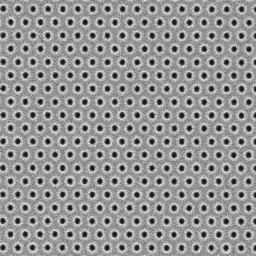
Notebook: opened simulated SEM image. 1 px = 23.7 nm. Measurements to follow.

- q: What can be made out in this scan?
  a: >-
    a regular array of holes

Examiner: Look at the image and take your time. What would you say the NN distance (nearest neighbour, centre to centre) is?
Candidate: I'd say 14.7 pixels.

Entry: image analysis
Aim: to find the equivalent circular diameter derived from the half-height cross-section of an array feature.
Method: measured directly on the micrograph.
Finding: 0.146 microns